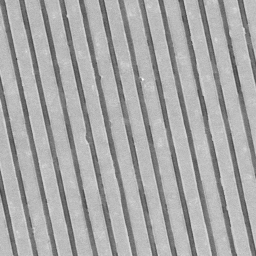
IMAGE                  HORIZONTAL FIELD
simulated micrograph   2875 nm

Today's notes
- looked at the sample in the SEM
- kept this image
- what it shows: parallel lines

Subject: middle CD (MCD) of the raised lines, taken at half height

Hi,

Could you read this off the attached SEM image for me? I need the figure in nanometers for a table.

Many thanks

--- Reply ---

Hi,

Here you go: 147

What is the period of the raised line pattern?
218 nanometers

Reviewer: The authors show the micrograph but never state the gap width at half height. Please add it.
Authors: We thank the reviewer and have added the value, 67.4 nm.